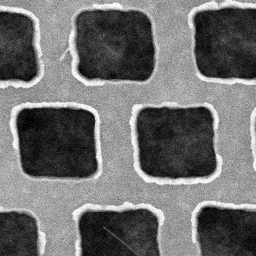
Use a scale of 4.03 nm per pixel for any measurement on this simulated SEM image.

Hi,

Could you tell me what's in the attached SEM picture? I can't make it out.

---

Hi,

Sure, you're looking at holes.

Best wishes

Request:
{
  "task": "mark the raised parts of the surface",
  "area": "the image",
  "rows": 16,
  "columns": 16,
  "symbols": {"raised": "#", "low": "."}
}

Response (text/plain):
##############.#
..###....###....
..###.....##....
..###.....##....
..###.....###...
################
################
#.....###....###
#.....###....###
#.....###....###
#.....###....###
################
################
..###.....##....
..###.....##....
..###.....##....